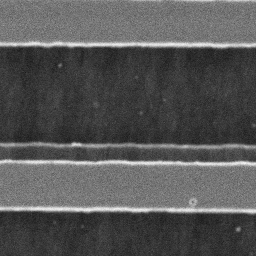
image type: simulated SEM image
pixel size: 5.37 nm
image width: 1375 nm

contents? lines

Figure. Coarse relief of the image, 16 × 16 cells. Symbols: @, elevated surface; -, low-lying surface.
@@@@@@@@@@@@@@@@
@@@@@@@@@@@@@@@@
@@@@@@@@@@@@@@@@
----------------
----------------
----------------
----------------
----------------
----------------
----------------
@@@@@@@@@@@@@@@@
@@@@@@@@@@@@@@@@
@@@@@@@@@@@@@@@@
----------------
----------------
----------------